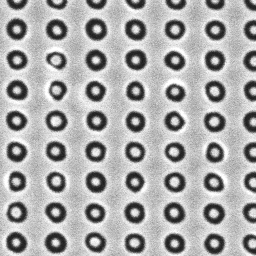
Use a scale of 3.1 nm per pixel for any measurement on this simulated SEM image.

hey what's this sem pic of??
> a regular array of ring-shaped grooves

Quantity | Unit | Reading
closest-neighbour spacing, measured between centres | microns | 0.0938